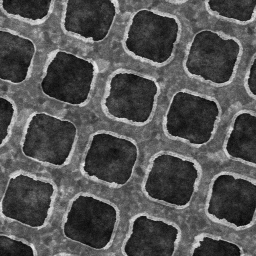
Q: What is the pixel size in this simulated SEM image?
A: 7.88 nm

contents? a regular array of holes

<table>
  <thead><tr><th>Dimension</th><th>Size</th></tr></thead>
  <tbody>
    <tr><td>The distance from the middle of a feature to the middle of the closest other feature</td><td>503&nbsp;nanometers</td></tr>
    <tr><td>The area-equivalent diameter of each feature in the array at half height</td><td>51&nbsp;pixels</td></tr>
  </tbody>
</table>